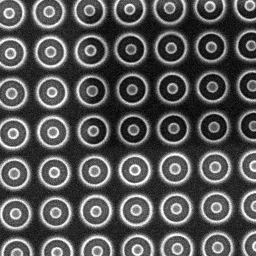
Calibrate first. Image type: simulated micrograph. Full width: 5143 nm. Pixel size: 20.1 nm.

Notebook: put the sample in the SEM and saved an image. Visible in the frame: an array of small figures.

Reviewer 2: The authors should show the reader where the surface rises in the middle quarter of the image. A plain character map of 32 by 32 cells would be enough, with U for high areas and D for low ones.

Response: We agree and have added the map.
UUUUUUUUUUUUUUUUUUUUUUUUUUUUUUUU
UUUUUUUUUUUUUUUUUUUUUUUUUUUUUUUU
UUUUUUUUUUUUUUUUUUUUUUUUUUUDUUUU
UUUUUUDDUUUUUUUDDDDUUUUUUDDDDUUU
UUUUDDDDDDUUUUDDDDDDUUUUDDDDDDUU
UUUUDDDDDDUUUUDDUUDDUUUUDDUUDDDU
UUUUDDUUDDUUUUDDUUDDDUUUDDUUDDDU
DUUUDDUUDDUUUUDDDDDDUUUUDDDDDDUU
UUUUDDDDDDUUUUDDDDDDUUUUUDDDDDUU
UUUUUDDDDUUUUUUDDDDUUUUUUUUDUUUU
UUUUUUUUUUUUUUUUUUUUUUUUUUUUUUUU
UUUUUUUUUUUUUUUUUUUUUUUUUUUUUUUU
UUUUUUUUUUUUUUUUUUUUUUUUUUUUUUUU
UUUUUUUDDUUUUUUDDDDUUUUUUDDDDDUU
UUUUUDDDDDUUUUUDDDDDUUUUDDDDDDUU
UUUUDDDDDDDUUUDDDUDDDUUUDDUUDDDU
DUUUDDUUDDDUUUDDUUUDDUUUDDUUUDDU
DUUUDDDUDDDUUUDDDUDDDUUUDDDDDDDU
UUUUDDDDDDUUUUUDDDDDUUUUUDDDDDUU
UUUUUDDDDUUUUUUUDDDUUUUUUUDDUUUU
UUUUUUUUUUUUUUUUUUUUUUUUUUUUUUUU
UUUUUUUUUUUUUUUUUUUUUUUUUUUUUUUU
UUUUUUUUUUUUUUUUUUUUUUUUUUUUUUUU
UUUUUUUDDUUUUUUUDDDUUUUUUUDDDDUU
UUUUUDDDDDUUUUUDDDDDDUUUUDDDDDDU
DUUUUDDDDDDUUUDDDDDDDUUUDDDUUDDU
DUUUDDDUUDDUUUDDDUUDDUUUDDDUUDDU
DUUUDDDUUDDUUUDDDUDDDUUUUDDDDDDU
DUUUUDDDDDDUUUUDDDDDDUUUUDDDDDUU
UUUUUUDDDDUUUUUUDDDUUUUUUUUDUUUU
UUUUUUUUUUUUUUUUUUUUUUUUUUUUUUUU
UUUUUUUUUUUUUUUUUUUUUUUUUUUUUUUU